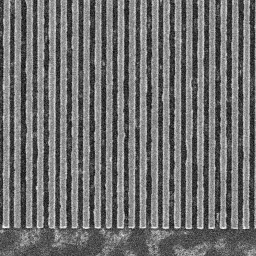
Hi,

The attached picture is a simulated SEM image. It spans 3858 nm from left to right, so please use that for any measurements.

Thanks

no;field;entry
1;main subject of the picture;parallel lines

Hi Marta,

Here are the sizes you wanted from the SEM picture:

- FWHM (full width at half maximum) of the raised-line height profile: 82.9 nanometres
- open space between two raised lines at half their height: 84.7 nm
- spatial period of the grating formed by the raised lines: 11.4 px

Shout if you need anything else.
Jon